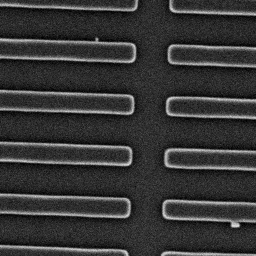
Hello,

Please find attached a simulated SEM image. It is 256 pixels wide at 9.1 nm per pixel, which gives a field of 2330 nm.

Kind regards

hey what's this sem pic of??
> groups of lines, slits or small figures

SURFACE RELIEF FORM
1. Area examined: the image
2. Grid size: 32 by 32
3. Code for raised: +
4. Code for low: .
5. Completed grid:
+++++++++++++++++....+++++++++++
......................++++++++++
................................
................................
................................
++++++++++++++++................
+++++++++++++++++....+++++++++++
........+++++++++....+++++++++++
................................
................................
................................
+++++...........................
+++++++++++++++++....++++++++++.
+++++++++++++++++....+++++++++++
........................++++++++
................................
................................
................................
++++++++++++++++................
++++++++++++++++.....+++++++++++
.............+++.....+++++++++++
................................
................................
................................
++++............................
++++++++++++++++....++++++++++++
++++++++++++++++....++++++++++++
..........................++++++
................................
................................
................................
++++++++++++++++................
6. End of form